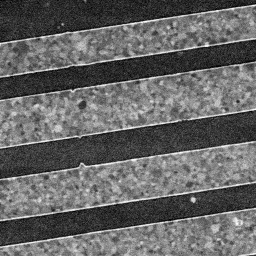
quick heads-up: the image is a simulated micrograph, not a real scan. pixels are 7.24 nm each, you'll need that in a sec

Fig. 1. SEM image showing one or a few lines or trenches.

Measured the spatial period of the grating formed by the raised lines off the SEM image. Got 502 nm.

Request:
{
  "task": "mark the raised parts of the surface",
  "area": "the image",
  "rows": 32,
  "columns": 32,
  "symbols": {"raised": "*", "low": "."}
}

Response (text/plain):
................................
..........................******
...................*************
.............*******************
......**************************
***************************.....
*********************...........
**************..................
*******....................*****
*....................***********
..............******************
.......*************************
********************************
********************************
***************************.....
********************............
*************...................
*******.........................
...........................*****
...................*************
.............*******************
.......*************************
********************************
***************************.....
*********************...........
**************..................
*******......................***
*.....................**********
................****************
.........***********************
...*****************************
********************************